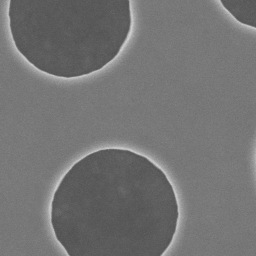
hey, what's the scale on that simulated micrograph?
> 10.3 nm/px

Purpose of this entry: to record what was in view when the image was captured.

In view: holes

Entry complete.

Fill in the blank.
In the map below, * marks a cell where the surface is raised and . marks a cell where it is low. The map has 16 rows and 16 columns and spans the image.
*.......******..
*.......*******.
*.......********
*......*********
***...**********
****************
****************
****************
****************
******..********
****......******
****.......*****
***........*****
***........*****
***........*****
****......******